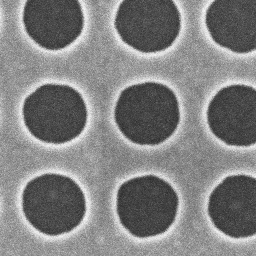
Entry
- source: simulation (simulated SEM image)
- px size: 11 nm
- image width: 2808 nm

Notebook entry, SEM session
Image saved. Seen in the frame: holes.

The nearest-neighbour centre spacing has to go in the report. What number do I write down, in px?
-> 91.5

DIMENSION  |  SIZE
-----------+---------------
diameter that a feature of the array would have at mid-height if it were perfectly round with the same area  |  700 nm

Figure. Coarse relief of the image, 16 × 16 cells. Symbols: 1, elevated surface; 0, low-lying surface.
1100011000011000
1000011000011000
1100011100011000
1111111111111111
1111111111111111
1100011100011100
1000011000011000
1000011000011000
1100011100011000
1111111111111111
1111111111111111
1100011100011100
1000011000011000
1100011000011000
1110111100111100
1111111111111111